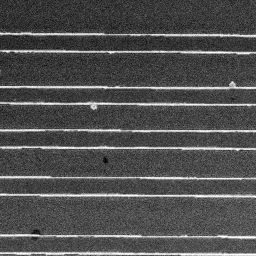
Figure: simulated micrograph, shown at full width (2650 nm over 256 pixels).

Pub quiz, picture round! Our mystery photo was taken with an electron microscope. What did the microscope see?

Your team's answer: lines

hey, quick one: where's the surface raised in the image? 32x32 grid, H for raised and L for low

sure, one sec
LLLLLLLLLLLLLLLLLLLLLLLLLLLLLLLL
LLLLLLLLLLLLLLLLLLLLLLLLLLLLLLLL
LLLLLLLLLLLLLLLLLLLLLLLLLLLLLLLL
LLLLLLLLLLLLLLLLLLLLLLLLLLLLLLLL
HHHHHHHHHHHHHHHHHHHHHHHHHHHHHHHH
HHHHHHHHHHHHHHHHHHHHHHHHHHHHHHHH
LLLLLLLLLLLLLLLLLLLLLLLHHHHHHHHH
LLLLLLLLLLLLLLLLLLLLLLLLLLLLLLLL
LLLLLLLLLLLLLLLLLLLLLLLLLLLLLLLL
LLLLLLLLLLLLLLLLLLLLLLLLLLLLLLLL
LLLLLLLLLLLLLLLLLLLLLLLLLLLLLLLL
HHHHHHHHHHHHHHHHHHHHHHHHHHHHHHHH
HHHHHHHHHHHHHHHHHHHHHHHHHHHHHHHH
LLLLLLLLLLLLLLLLLLLLLLLLLLLLLLLL
LLLLLLLLLLLLLLLLLLLLLLLLLLLLLLLL
LLLLLLLLLLLLLLLLLLLLLLLLLLLLLLLL
HHHHHHHHHHHHHHHHHHHHHHHHHHHHHHHH
HHHHHHHHHHHHHHHHHHHHHHHHHHHHHHHH
LLLLLLLLLLLLLLLLLLLLLLLHHHHHHHHH
LLLLLLLLLLLLLLLLLLLLLLLLLLLLLLLL
LLLLLLLLLLLLLLLLLLLLLLLLLLLLLLLL
LLLLLLLLLLLLLLLLLLLLLLLLLLLLLLLL
HHHHHHHHHHHHHHHHHHHHHHHHHHHHHHHH
HHHHHHHHHHHHHHHHHHHHHHHHHHHHHHHH
LLLLLLLLLLLLLLLLLLLLLLLLLLHHHHHH
LLLLLLLLLLLLLLLLLLLLLLLLLLLLLLLL
LLLLLLLLLLLLLLLLLLLLLLLLLLLLLLLL
LLLLLLLLLLLLLLLLLLLLLLLLLLLLLLLL
LLLLLLLLLLLLLLLLLLLLLLLLLLLLLLLL
HHHHHLLLLLLLLLLLLLLLLLLLLLLLLLLL
HHHHHHHHHHHHHHHHHHHHHHHHHHHHHHHH
HHHHHHHHHHHHHHHHHHHHHHHHHHHHHHHH